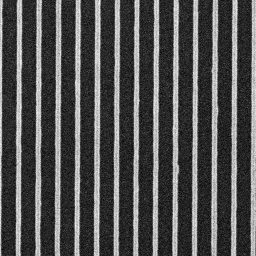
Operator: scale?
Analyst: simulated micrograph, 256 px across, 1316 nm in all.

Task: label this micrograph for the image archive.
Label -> parallel lines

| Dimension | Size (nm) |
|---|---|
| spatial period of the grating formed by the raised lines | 101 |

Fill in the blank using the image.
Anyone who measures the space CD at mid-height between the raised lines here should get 15.4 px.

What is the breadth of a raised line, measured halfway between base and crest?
23.2 nanometres